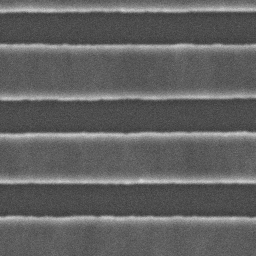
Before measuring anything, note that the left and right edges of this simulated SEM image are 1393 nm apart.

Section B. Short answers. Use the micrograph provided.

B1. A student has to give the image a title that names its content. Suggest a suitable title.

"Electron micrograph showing lines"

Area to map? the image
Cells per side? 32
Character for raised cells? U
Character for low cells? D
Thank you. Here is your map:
UUUUUUUUUUUUUUUUUUUUUUUUUUUUUUUU
DDDDDDDDDDDDDDDDDDDDDDDDDDDDDDDD
DDDDDDDDDDDDDDDDDDDDDDDDDDDDDDDD
DDDDDDDDDDDDDDDDDDDDDDDDDDDDDDDD
DDDDDDDDDDDDDDDDDDDDDDDDDDDDDDDD
DDDDDDDDDDDDDDDDDDDDDDDDDDDDDDDD
UUUUUUUUUUUUUUUUUUUUUUUUUUUUUUUU
UUUUUUUUUUUUUUUUUUUUUUUUUUUUUUUU
UUUUUUUUUUUUUUUUUUUUUUUUUUUUUUUU
UUUUUUUUUUUUUUUUUUUUUUUUUUUUUUUU
UUUUUUUUUUUUUUUUUUUUUUUUUUUUUUUU
UUUUUUUUUUUUUUUUUUUUUUUUUUUUUUUU
DDDDDDDDDDDDDDDDDDDDDDDDDDDDDDDD
DDDDDDDDDDDDDDDDDDDDDDDDDDDDDDDD
DDDDDDDDDDDDDDDDDDDDDDDDDDDDDDDD
DDDDDDDDDDDDDDDDDDDDDDDDDDDDDDDD
DDDDDDDDDDDDDDDDDDDDDDDDDDDDDDDD
UUUUUUUUUUUUUUUUUUUUUUUUUUUUUUUU
UUUUUUUUUUUUUUUUUUUUUUUUUUUUUUUU
UUUUUUUUUUUUUUUUUUUUUUUUUUUUUUUU
UUUUUUUUUUUUUUUUUUUUUUUUUUUUUUUU
UUUUUUUUUUUUUUUUUUUUUUUUUUUUUUUU
UUUUUUUUUUUUUUUUUUUUUUUUUUUUUUUU
DDDDDDDDDDDDDDDDDDDDDDDDDDDDDDDD
DDDDDDDDDDDDDDDDDDDDDDDDDDDDDDDD
DDDDDDDDDDDDDDDDDDDDDDDDDDDDDDDD
DDDDDDDDDDDDDDDDDDDDDDDDDDDDDDDD
UUUUUUUUUUUUUUUUUUUUUUUUUUUUUUUU
UUUUUUUUUUUUUUUUUUUUUUUUUUUUUUUU
UUUUUUUUUUUUUUUUUUUUUUUUUUUUUUUU
UUUUUUUUUUUUUUUUUUUUUUUUUUUUUUUU
UUUUUUUUUUUUUUUUUUUUUUUUUUUUUUUU